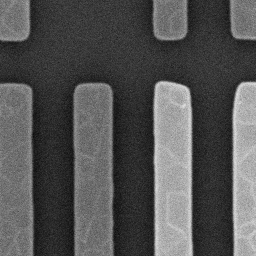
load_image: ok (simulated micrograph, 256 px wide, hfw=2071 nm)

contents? wiring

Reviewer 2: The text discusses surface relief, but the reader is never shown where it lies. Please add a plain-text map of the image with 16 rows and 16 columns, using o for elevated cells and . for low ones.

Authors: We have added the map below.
oo........oo..oo
oo........oo..oo
o...............
................
................
oo...oo...oo...o
oo...oo...oo...o
oo...oo...oo...o
oo...oo...oo...o
oo...oo...oo...o
oo...oo...oo...o
oo...oo...oo...o
oo...oo...oo...o
oo...oo...oo...o
oo...oo...oo...o
oo...oo...oo...o